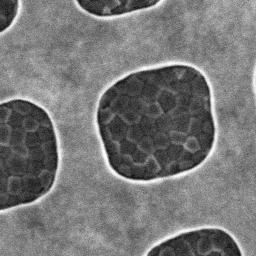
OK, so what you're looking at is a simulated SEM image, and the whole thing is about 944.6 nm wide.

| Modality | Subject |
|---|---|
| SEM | holes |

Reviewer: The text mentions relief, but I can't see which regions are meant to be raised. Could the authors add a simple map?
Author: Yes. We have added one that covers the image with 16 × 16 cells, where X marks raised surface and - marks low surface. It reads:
-XXXX----XXXXXXX
-XXXXXXXXXXXXXXX
XXXXXXXXXXXXXXXX
XXXXXXXXXXXXXXXX
XXXXXXXXX---XXXX
XXXXXXX------XXX
--XXXX-------XXX
---XXX-------XXX
----XX-------XXX
----XXX------XXX
----XXX-----XXXX
---XXXXXXXXXXXXX
--XXXXXXXXXXXXXX
XXXXXXXXXXXXXXXX
XXXXXXXXXXXX--XX
XXXXXXXXXX-----X